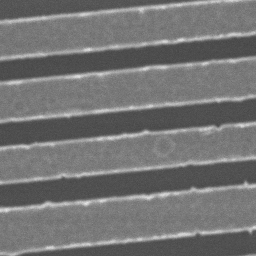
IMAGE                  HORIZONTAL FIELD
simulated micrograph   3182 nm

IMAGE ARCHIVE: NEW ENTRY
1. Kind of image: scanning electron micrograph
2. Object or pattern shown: one or a few lines or trenches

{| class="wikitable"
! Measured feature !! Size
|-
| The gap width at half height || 0.303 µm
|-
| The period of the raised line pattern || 791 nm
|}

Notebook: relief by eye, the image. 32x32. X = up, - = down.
----------------------XXXXXXXXXX
------------XXXXXXXXXXXXXXXXXXXX
--XXXXXXXXXXXXXXXXXXXXXXXXXXXXXX
XXXXXXXXXXXXXXXXXXXXXXXXXXXXXXXX
XXXXXXXXXXXXXXXXXXXXXXXXXXXXX---
XXXXXXXXXXXXXXXXXXXX------------
XXXXXXXXXX----------------------
----------------------------XXXX
------------------XXXXXXXXXXXXXX
--------XXXXXXXXXXXXXXXXXXXXXXXX
XXXXXXXXXXXXXXXXXXXXXXXXXXXXXXXX
XXXXXXXXXXXXXXXXXXXXXXXXXXXXXXXX
XXXXXXXXXXXXXXXXXXXXXXXXXXXX-X--
XXXXXXXXXXXXXXXXXX--------------
XXXXXXXXX-----------------------
------------------------------XX
------------------X-XXXXXXXXXXXX
----------XXXXXXXXXXXXXXXXXXXXXX
XXXXXXXXXXXXXXXXXXXXXXXXXXXXXXXX
XXXXXXXXXXXXXXXXXXXXXXXXXXXXXXXX
XXXXXXXXXXXXXXXXXXXXXXXXX-------
XXXXXXXXXXXXXXX-----------------
XXXXX---------------------------
---------------------------XXXXX
-----------------XXXXXXXXXXXXXXX
-----XXXXXXXXXXXXXXXXXXXXXXXXXXX
XXXXXXXXXXXXXXXXXXXXXXXXXXXXXXXX
XXXXXXXXXXXXXXXXXXXXXXXXXXXXXXXX
XXXXXXXXXXXXXXXXXXXXXXXXXXXXXXXX
XXXXXXXXXXXXXXXXXXXXXXX---------
XXXXXXXXXXXXX-------------------
XXX-----------------------------